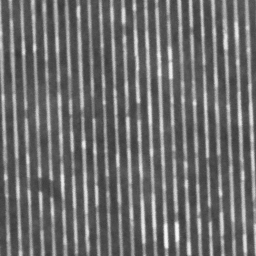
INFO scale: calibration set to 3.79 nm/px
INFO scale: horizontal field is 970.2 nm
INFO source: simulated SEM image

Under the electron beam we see parallel lines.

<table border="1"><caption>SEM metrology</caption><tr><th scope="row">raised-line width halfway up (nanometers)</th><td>9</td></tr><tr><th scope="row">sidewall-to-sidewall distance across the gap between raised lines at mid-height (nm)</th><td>33.6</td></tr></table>